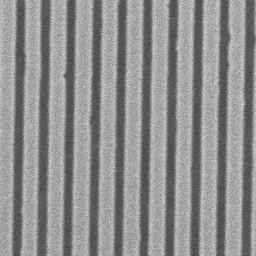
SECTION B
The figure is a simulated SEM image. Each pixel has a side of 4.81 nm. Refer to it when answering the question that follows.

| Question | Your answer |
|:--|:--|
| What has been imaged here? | parallel lines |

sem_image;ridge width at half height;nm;80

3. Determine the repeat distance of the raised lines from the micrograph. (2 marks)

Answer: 25.5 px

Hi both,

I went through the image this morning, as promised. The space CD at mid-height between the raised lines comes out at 42.1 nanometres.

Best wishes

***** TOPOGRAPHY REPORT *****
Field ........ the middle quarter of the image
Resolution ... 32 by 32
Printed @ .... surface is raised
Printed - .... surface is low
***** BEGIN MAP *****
---@@@@--@@@@---@@@---@@@@--@@@@
---@@@@--@@@@---@@@---@@@@--@@@@
---@@@@--@@@@---@@@---@@@@--@@@@
---@@@@--@@@@--@@@@---@@@@--@@@@
---@@@@--@@@@--@@@@---@@@@--@@@@
---@@@@--@@@@--@@@@---@@@@--@@@@
---@@@@--@@@@--@@@@---@@@@--@@@@
---@@@@--@@@@--@@@@---@@@@--@@@@
---@@@@--@@@@--@@@@---@@@@--@@@@
---@@@@--@@@@--@@@@---@@@@--@@@@
---@@@@--@@@@--@@@@---@@@@--@@@@
---@@@@--@@@@--@@@@---@@@@--@@@@
---@@@@--@@@@--@@@@---@@@@--@@@@
---@@@@--@@@@--@@@@---@@@@--@@@@
---@@@---@@@@--@@@@---@@@@--@@@@
---@@@@--@@@@--@@@@---@@@@--@@@@
---@@@---@@@@--@@@@---@@@@--@@@@
---@@@@--@@@@--@@@@---@@@@--@@@@
---@@@@--@@@@--@@@@---@@@@--@@@@
---@@@@--@@@@--@@@@---@@@@--@@@@
---@@@@--@@@@--@@@@---@@@---@@@@
--@@@@@--@@@@--@@@@---@@@---@@@@
--@@@@@--@@@@--@@@@---@@@---@@@@
--@@@@@--@@@@--@@@@---@@@---@@@@
--@@@@@--@@@@--@@@@---@@@---@@@@
--@@@@@--@@@@--@@@@--@@@@---@@@@
--@@@@@--@@@@--@@@@--@@@@---@@@@
--@@@@@--@@@@--@@@@--@@@@---@@@@
--@@@@@--@@@@--@@@@--@@@@---@@@@
--@@@@@--@@@@--@@@@--@@@@---@@@@
--@@@@---@@@@--@@@@--@@@@---@@@@
--@@@@---@@@@--@@@@--@@@@---@@@@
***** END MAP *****